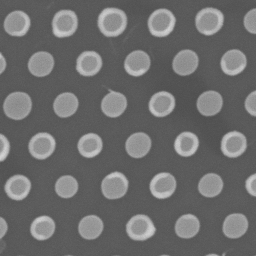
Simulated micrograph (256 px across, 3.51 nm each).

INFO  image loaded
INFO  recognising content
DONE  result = a regular array of raised bodies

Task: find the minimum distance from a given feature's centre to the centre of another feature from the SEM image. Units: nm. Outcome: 165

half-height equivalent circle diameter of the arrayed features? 90.2 nm